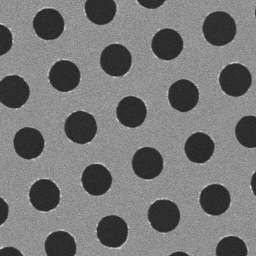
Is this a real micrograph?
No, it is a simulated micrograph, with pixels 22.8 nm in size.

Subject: a regular array of holes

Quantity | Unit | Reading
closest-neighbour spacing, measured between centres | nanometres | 1220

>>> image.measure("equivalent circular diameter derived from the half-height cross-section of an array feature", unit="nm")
731